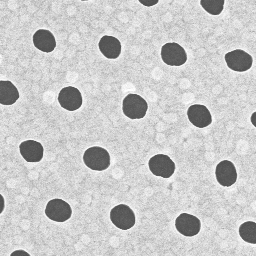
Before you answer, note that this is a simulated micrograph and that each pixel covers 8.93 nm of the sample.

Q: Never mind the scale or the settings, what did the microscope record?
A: a regular array of holes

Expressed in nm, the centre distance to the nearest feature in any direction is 569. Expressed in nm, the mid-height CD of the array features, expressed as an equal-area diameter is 220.